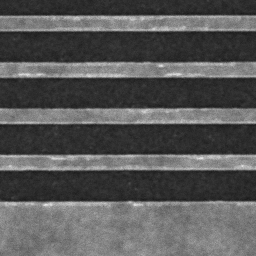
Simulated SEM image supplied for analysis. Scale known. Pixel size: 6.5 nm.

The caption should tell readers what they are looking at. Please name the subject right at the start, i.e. parallel lines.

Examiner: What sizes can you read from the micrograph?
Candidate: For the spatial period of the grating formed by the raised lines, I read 302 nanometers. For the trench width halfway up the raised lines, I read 0.207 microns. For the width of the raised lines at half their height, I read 94.2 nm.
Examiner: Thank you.